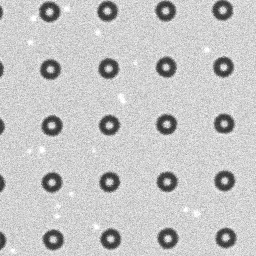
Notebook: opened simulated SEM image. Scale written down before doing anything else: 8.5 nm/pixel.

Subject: a regular array of ring-shaped grooves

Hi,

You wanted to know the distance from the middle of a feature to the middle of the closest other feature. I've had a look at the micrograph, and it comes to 482 nm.